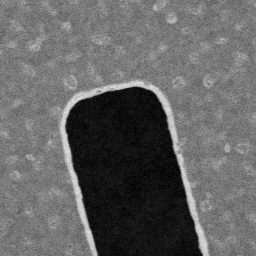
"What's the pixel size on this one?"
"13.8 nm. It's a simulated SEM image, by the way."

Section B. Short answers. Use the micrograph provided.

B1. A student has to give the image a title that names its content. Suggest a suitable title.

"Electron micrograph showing one or a few lines or trenches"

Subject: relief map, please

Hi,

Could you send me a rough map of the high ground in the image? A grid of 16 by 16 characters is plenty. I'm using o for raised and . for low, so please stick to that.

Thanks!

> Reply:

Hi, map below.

oooooooooooooooo
oooooooooooooooo
oooooooooooooooo
oooooooooooooooo
oooooooooooooooo
ooooooo..ooooooo
oooo......oooooo
oooo.......ooooo
oooo.......ooooo
oooo.......ooooo
oooo.......ooooo
ooooo.......oooo
ooooo.......oooo
ooooo.......oooo
ooooo........ooo
oooooo.......ooo